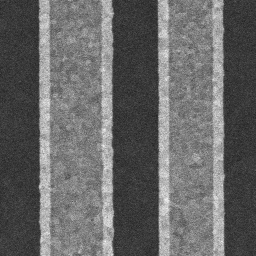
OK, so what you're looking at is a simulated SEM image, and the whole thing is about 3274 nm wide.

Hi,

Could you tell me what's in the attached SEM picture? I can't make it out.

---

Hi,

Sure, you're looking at one or a few lines or trenches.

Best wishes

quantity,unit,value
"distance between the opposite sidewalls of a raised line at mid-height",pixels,58.5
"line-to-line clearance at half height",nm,724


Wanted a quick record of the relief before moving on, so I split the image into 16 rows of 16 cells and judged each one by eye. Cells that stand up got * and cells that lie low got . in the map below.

...****...****..
...****...****..
...****...****..
...****...****..
...****...****..
...****...****..
...****...****..
...****...****..
...****...****..
...****...****..
...****...****..
...****...****..
...****...****..
...****...****..
...****...****..
...****...****..